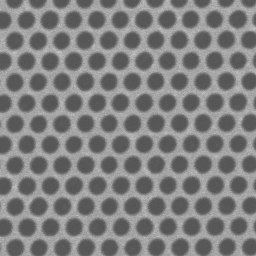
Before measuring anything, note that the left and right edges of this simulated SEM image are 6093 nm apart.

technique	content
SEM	a regular array of holes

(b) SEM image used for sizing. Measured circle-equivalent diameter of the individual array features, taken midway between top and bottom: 446 nm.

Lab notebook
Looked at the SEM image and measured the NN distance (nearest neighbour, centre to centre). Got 556 nm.